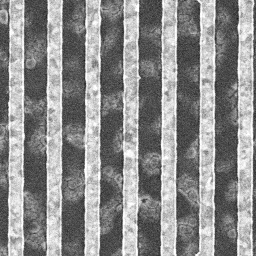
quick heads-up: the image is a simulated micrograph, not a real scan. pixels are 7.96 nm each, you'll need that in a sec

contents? parallel lines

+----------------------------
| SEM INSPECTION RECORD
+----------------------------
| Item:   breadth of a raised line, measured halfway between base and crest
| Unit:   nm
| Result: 108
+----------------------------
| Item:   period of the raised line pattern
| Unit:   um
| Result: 0.304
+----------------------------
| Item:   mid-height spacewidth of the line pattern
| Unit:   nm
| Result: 194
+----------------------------